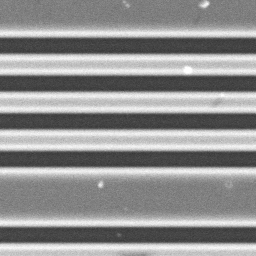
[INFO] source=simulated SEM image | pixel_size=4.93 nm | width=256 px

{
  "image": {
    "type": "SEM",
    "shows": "groups of lines, slits or small figures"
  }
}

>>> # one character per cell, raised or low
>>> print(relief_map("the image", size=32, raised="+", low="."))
++++++++++++++++++++++++++++++++
++++++++++++++++++++++++++++++++
++++++++++++++++++++++++++++++++
++++++++++++++++++++++++++++++++
................................
................................
................................
++++++++++++++++++++++++++++++++
++++++++++++++++++++++++++++++++
................................
................................
................................
++++++++++++++++++++++++++++++++
++++++++++++++++++++++++++++++++
................................
................................
................................
++++++++++++++++++++++++++++++++
++++++++++++++++++++++++++++++++
................................
................................
++++++++++++++++++++++++++++++++
++++++++++++++++++++++++++++++++
++++++++++++++++++++++++++++++++
++++++++++++++++++++++++++++++++
++++++++++++++++++++++++++++++++
++++++++++++++++++++++++++++++++
++++++++++++++++++++++++++++++++
................................
................................
................................
++++++++++++++++++++++++++++++++